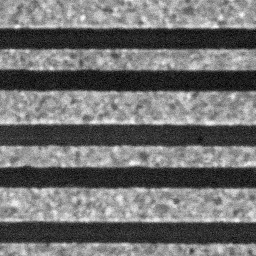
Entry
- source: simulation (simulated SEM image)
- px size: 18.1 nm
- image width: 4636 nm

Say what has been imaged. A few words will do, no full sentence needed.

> lines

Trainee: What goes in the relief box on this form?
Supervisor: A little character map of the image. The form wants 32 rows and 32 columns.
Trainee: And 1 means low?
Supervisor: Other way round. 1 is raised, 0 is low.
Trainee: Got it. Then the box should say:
11111111111111111111111111111111
11111111111111111111111111111111
11111111111111111111111111111111
00000000000000000000000000000000
00000000000000000000000000000000
00000000000000000000000000000000
11111111111111111111111111111111
11111111111111111111111111111111
11111111111111111111111111111111
00000000000000000000000000000000
00000000000000000000000000000000
01110000000000000000000000000000
11111111111111111111111111111111
11111111111111111111111111111111
11111111111111111111111111111111
00000000000000000000011011111111
00000000000000000000000000000000
00000000000000000000000000000000
11111111111111111111111111111111
11111111111111111111111111111111
11111111111111111111111111111111
00000000000000000000000000000000
00000000000000000000000000000000
00000000000000000000000000000000
11111111111111111111111111111111
11111111111111111111111111111111
11111111111111111111111111111111
11111111111111111111111111111111
00000000000000000000000000000000
00000000000000000000000000000000
00000000010000000000000000000000
11111111111111111111111111111111